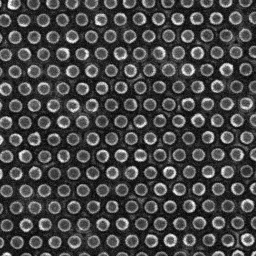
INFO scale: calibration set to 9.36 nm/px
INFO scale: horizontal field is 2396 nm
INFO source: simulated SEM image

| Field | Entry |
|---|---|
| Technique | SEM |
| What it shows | a regular array of raised bodies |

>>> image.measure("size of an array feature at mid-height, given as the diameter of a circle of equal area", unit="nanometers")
113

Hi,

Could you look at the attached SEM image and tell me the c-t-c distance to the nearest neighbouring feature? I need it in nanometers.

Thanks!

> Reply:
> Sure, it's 178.